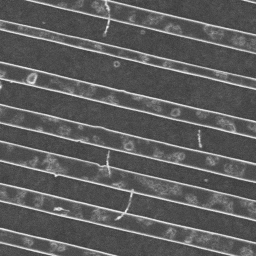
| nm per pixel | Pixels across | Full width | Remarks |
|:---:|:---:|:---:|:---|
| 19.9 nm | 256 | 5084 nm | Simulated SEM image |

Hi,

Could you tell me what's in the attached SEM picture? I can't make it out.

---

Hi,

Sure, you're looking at parallel lines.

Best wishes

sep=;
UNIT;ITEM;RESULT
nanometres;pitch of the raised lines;808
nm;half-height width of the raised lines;336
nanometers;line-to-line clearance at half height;503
